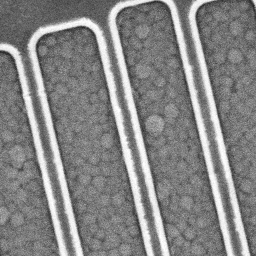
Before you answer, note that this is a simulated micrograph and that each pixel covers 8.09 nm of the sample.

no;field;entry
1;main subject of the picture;one or a few lines or trenches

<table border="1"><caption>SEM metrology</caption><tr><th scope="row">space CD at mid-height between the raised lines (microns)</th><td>0.509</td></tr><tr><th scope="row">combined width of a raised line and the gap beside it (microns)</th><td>0.656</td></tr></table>